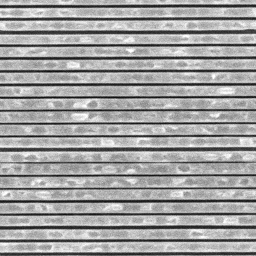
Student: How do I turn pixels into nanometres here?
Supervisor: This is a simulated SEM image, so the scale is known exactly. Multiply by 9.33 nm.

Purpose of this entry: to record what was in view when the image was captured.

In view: parallel lines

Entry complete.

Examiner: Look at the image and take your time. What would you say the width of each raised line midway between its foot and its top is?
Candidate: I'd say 0.0909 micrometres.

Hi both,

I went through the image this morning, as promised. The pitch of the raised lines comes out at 0.122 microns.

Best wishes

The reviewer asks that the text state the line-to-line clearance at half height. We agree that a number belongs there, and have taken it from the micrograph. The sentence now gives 32.6 nm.